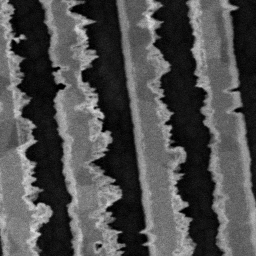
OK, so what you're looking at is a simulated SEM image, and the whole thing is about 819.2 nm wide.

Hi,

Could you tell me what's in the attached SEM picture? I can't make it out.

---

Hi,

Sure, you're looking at one or a few lines or trenches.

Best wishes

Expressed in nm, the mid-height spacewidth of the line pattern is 127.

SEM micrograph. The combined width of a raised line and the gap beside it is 231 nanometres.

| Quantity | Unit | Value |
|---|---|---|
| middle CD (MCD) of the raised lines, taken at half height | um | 0.103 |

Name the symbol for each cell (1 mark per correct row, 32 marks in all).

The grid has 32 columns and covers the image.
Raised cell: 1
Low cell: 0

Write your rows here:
10000011100000011110000011110000
10000011100000011110000011111000
10000011110000011110000011110000
10000011110000011110000011111000
10000001111000001110000011111000
10000001111000001110000001111000
10000001111000001111000011111000
11000001111100001111000001111000
11000001110000001111100001111000
11000001110000001111000001111000
11000000110000001110000001111000
11000001111000000111000000111000
11100001111100000111000000111100
11000001111100000111100000111000
11100000111110000111100000111100
11110000111110000111100000111100
11110000111110000111100000011100
11110000111111000111100000011100
11100000111110000111101000011110
11100000111110000011111000011110
11110000111000000011110000011110
11110000111100000011110000011110
11110000011110000011110000011110
11110000011110000011110000011110
11110000011111100011110000011110
11110000011111000011111000011111
11111100011110000001111000011111
11111000011110000001111100001111
11111000011110000011111000001111
11111000001111000001111000001111
01110000001111100001111000001111
01110000001111100001111000001111